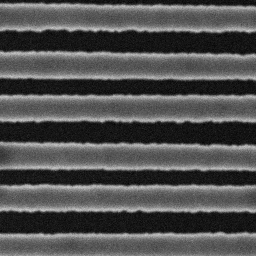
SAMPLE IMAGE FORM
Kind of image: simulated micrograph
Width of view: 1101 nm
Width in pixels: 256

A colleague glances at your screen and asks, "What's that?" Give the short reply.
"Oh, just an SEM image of lines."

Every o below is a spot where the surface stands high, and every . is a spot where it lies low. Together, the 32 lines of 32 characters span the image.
..o.............................
oooooooooooooooooooooooooooooooo
oooooooooooooooooooooooooooooooo
oooooooooooooooooooooooooooooooo
................................
................................
oooooooooo..o...................
oooooooooooooooooooooooooooooooo
oooooooooooooooooooooooooooooooo
oooooooooooooooooooooooooooooooo
................................
................................
oooooooooooooooooooooooooooooooo
oooooooooooooooooooooooooooooooo
oooooooooooooooooooooooooooooooo
................................
................................
................................
oooooooooooooooooooooooooooooooo
oooooooooooooooooooooooooooooooo
oooooooooooooooooooooooooooooooo
................................
................................
oooooooooooooooooooooooooooooooo
oooooooooooooooooooooooooooooooo
oooooooooooooooooooooooooooooooo
..................o.....o......o
................................
................................
oooooooooooooooooooooooooooooooo
oooooooooooooooooooooooooooooooo
oooooooooooooooooooooooooooooooo